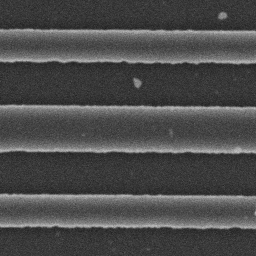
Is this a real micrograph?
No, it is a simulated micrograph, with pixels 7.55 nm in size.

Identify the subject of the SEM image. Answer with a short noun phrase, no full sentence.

lines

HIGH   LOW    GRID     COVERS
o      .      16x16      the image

................
................
oooooooooooooooo
oooooooooooooooo
................
................
................
oooooooooooooooo
oooooooooooooooo
......o.oooooooo
................
................
oooooooooooooooo
oooooooooooooooo
................
................